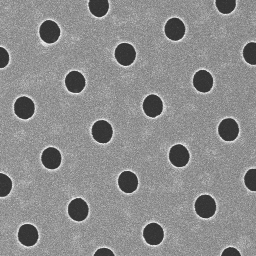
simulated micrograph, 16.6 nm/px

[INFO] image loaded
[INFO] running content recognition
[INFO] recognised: a regular array of holes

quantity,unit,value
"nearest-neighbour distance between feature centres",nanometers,932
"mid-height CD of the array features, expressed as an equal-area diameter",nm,367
